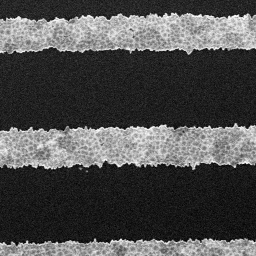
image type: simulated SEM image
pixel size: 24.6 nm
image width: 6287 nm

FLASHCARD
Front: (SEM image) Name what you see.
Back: one or a few lines or trenches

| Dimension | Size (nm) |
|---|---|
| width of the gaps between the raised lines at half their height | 1890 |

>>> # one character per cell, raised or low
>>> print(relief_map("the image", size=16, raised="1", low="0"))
0000000000000000
1111111111111111
1111111111111111
0000000000000000
0000000000000000
0000000000000000
0000000000000000
0000000000000000
1111111111111111
1111111111111111
0000000000000000
0000000000000000
0000000000000000
0000000000000000
0000000000000000
1111111111111111